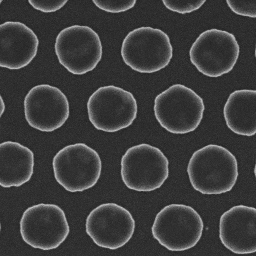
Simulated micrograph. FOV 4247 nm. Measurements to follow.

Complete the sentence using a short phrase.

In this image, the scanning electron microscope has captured a regular array of raised bodies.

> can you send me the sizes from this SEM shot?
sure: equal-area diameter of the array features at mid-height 779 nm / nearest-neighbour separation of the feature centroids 1.11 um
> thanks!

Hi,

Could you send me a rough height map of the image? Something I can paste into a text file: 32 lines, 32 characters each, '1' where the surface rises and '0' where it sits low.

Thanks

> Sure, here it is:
00001111000011111000011110000111
00000000000000100000001000000111
00000000000000000000000000000000
11100000011000000010000000000000
11110001111100001111100001111000
11111001111110011111100011111100
11111001111110011111100011111100
11110001111100001111100011111100
01000000111100000111000001111000
00000000000000000000000000000000
00000000000000000000000000000000
00001111000011110000111100000111
00011111000111111001111110001111
00011111100111111001111110001111
00011111100111111000111110001111
00001111000011110000111110001111
00000000000000000000001000000111
00000000000000000000000000000000
11100000111000000110000000110000
11110001111100001111100011111000
11110001111110011111100011111100
11110001111110011111100011111100
11100001111100011111100011111000
00000000111000001111000011111000
00000000000000000000000000000000
00000000000001000000000000000000
00011111000111110000111110001111
00011111000111111001111110001111
00011111100111111001111110011111
00011111000111110001111110001111
00001110000011100000111100001111
00000000000000000000000000000110